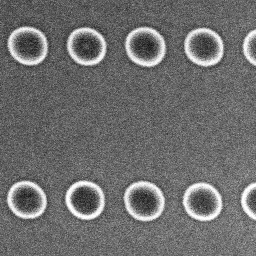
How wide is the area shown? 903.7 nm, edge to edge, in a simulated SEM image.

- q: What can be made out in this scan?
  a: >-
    a regular array of raised bodies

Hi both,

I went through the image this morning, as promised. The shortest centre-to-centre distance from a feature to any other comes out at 0.207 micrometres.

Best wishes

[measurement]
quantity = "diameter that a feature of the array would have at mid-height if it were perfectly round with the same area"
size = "129 nanometres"